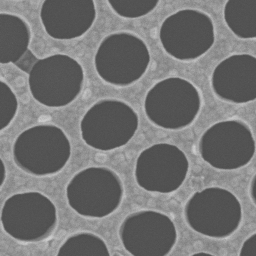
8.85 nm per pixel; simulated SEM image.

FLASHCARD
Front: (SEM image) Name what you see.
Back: a regular array of holes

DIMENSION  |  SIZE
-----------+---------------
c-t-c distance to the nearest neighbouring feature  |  598 nm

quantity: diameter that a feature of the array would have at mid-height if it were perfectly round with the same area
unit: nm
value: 466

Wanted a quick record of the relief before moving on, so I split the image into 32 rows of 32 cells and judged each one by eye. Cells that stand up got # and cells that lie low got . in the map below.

#####.......##......########....
#####.......###....###...###....
...##.......#########.....##....
...###.....#########.......##...
....##....###....###.......###..
....#########.....##.......#####
....########.......##.....######
.........###.......#########....
##........##......#########.....
####......###.....#########.....
.###......#####.####....###.....
..##......#########......##.....
..###....#########.......####...
..#########.....##.......#######
..#########......#......########
.#########.......###....###...##
###.....##.......#########.....#
##......###.....#########.......
##.......###..#####...###.......
##.......########......##.......
##......#########.......##.....#
.###...###....###......#########
.########......##......#########
########.......###....####..###.
##....##.......#########.....###
#......##......########.......##
.......###....####.####.......##
.......#########.....##.......##
.......########.......##......##
#.....###...###.......####..###.
########.....##.......########..
#######.......##.....#########..